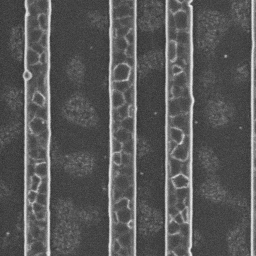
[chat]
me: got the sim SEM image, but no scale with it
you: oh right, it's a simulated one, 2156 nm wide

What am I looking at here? one or a few lines or trenches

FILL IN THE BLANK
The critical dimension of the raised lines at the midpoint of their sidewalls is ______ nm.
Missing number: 210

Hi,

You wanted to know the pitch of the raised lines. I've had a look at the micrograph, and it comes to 70.8 pixels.